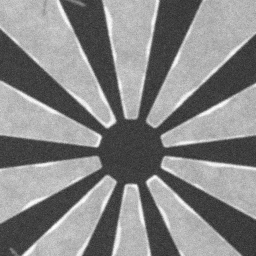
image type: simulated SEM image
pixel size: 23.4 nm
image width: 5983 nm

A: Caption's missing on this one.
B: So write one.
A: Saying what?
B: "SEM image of groups of lines, slits or small figures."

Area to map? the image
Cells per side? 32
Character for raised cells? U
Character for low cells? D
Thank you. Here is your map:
UUUUUUUDDDDDDUUUUUUUDDDDDUUUUUUU
UUUUUUUUDDDDDUUUUUUDDDDDDUUUUUUU
UUUUUUUUDDDDDDUUUUUDDDDDUUUUUUUU
UUUUUUUUUDDDDDUUUUUDDDDDUUUUUUUU
DUUUUUUUUDDDDDUUUUUDDDDUUUUUUUUU
DDUUUUUUUUDDDDUUUUUDDDDUUUUUUUDD
DDDUUUUUUUDDDDUUUUUDDDUUUUUUUDDD
DDDDUUUUUUUDDDUUUUDDDDUUUUUUDDDD
DDDDDUUUUUUDDDUUUUDDDUUUUUUDDDDD
DDDDDDUUUUUUDDDUUUDDDUUUUUDDDDDD
UDDDDDDUUUUUDDDUUUDDUUUUUDDDDDDD
UUDDDDDDDUUUUDDUUUDDUUUUDDDDDDUU
UUUUDDDDDDUUUDDUUUDUUUUDDDDDUUUU
UUUUUUDDDDDUUUDUUDDUUUDDDDDUUUUU
UUUUUUUUDDDDUUDDUDDUUDDDDUUUUUUU
UUUUUUUUUUDDDUDDDDDUDDDUUUUUUUUU
UUUUUUUUUUUUDDDDDDDDDUUUUUUUUUUU
DDDDDUUUUUUUDDDDDDDDUUUUUUUDDDDD
DDDDDDDDDDDDDDDDDDDDDDDDDDDDDDDD
DDDDDDDDDDDDDDDDDDDDDDDDDDDDDDDD
DDDDDDUUUUUUUDDDDDDDUUUUUUDDDDDD
UUUUUUUUUUUUDDDDDDDDDUUUUUUUUUUU
UUUUUUUUUUDDDUDDDDDUDDDUUUUUUUUU
UUUUUUUUDDDDUUDDUDDUUDDDDUUUUUUU
UUUUUUDDDDDUUUDUUDDUUUDDDDDUUUUU
UUUUDDDDDDUUUDDUUUDDUUUDDDDDDUUU
UUDDDDDDDUUUUDDUUUDDUUUUDDDDDDUU
UDDDDDDDUUUUDDDUUUDDDUUUUDDDDDDD
DDDDDDDUUUUUDDDUUUDDDUUUUUDDDDDD
DDDDDUUUUUUDDDDUUUDDDUUUUUUDDDDD
DDDDUUUUUUUDDDDUUUUDDDUUUUUUUDDD
DDDDUUUUUUDDDDUUUUUDDDDUUUUUUUDD